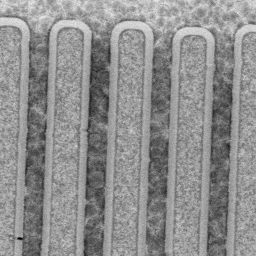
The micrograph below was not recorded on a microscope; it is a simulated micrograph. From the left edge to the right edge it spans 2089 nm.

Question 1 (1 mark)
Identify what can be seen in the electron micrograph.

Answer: one or a few lines or trenches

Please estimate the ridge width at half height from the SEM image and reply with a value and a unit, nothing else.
293 nanometres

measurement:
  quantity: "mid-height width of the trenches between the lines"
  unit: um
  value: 0.209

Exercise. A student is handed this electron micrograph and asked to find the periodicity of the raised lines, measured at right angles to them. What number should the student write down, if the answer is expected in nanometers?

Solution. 504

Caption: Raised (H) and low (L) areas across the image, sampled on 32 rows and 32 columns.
LLLLLLLLLLLLLLLLLLLLLLLLLLLLLLLL
LLLLLLLLLLLLLLLLLLLLLLLLLLLLLLLL
LLLLLLLLLLLLLLLLLLLLLLLLLLLLLLLL
HHHLLLLHHHHLLLLHHHLLLLLLLLLLLLLH
HHHLLLLHHHHLLLHHHHHLLLHHHHLLLLHH
HHHLLLLHHHHLLLHHHHHLLLHHHHLLLLHH
HHHLLLHHHHHLLLHHHHHLLLHHHHLLLLHH
HHHLLLHHHHHLLLHHHHHLLLHHHHLLLLHH
HHHLLLHHHHHLLLHHHHHLLLHHHHLLLLHH
HHHLLLHHHHHLLLHHHHHLLLHHHHLLLLHH
HHHLLLHHHHHLLLHHHHHLLLHHHHLLLHHH
HHHLLLHHHHHLLLHHHHLLLLHHHHLLLHHH
HHHLLLHHHHHLLLHHHHLLLLHHHHLLLHHH
HHHLLLHHHHHLLLHHHHLLLLHHHHLLLHHH
HHHLLLHHHHHLLLHHHHLLLLHHHHLLLHHH
HHHLLLHHHHHLLLHHHHLLLLHHHHLLLHHH
HHHLLLHHHHHLLLHHHHLLLLHHHHLLLHHH
HHHLLLHHHHHLLLHHHHLLLLHHHHLLLHHH
HHHLLLHHHHHLLLHHHHLLLHHHHHLLLHHH
HHHLLLHHHHLLLLHHHHLLLHHHHHLLLHHH
HHHLLLHHHHLLLLHHHHLLLHHHHHLLLHHH
HHHLLLHHHHLLLLHHHHLLLHHHHHLLLHHH
HHHLLLHHHHLLLLHHHHLLLHHHHHLLLHHH
HHHLLLHHHHLLLLHHHHLLLHHHHHLLLHHH
HHHLLLHHHHLLLHHHHHLLLHHHHHLLLHHH
HHHLLLHHHHLLLLHHHHLLLHHHHHLLLHHH
HHHLLLHHHHLLLLHHHHLLLHHHHHLLLHHH
HHLLLLHHHHLLLHHHHHLLLHHHHHLLLHHH
HHLLLLHHHHLLLHHHHHLLLHHHHHLLLHHH
HHLLLLHHHHLLLHHHHHLLLHHHHLLLLHHH
HHLLLHHHHHLLLHHHHHLLLHHHHLLLLHHH
HHLLLHHHHHLLLHHHHHLLLHHHHLLLLHHH